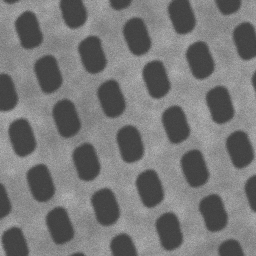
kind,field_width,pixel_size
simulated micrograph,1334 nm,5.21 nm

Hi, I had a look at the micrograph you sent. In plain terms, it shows a regular array of holes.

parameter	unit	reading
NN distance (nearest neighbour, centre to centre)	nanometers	249